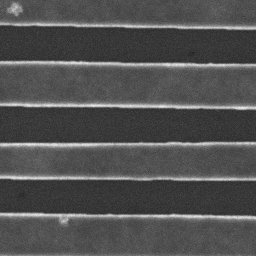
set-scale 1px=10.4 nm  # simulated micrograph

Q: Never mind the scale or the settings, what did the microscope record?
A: lines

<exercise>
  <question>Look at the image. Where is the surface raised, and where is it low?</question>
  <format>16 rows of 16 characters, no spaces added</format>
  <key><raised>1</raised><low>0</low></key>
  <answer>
1111111111111111
1111111111111111
0000000000000000
0000000000000000
1111111111111111
1111111111111111
1111111111111111
0000000000000000
0000000000000000
1111111111111111
1111111111111111
0000000000000000
0000000000000000
1111111111111000
1111111111111111
1111111111111111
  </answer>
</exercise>